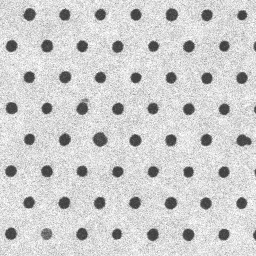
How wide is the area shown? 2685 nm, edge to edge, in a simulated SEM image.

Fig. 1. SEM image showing a regular array of holes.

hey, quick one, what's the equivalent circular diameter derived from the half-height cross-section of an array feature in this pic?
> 126 nm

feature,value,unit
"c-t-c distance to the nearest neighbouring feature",369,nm